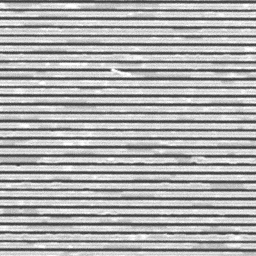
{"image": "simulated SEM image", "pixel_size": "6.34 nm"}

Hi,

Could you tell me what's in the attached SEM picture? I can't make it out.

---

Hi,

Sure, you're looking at parallel lines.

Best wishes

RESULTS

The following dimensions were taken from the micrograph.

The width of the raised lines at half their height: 31.7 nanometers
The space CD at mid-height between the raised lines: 0.019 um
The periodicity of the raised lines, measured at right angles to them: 54.3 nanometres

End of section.